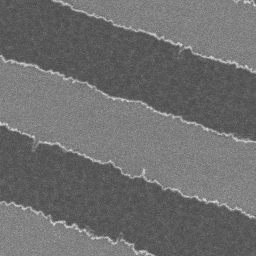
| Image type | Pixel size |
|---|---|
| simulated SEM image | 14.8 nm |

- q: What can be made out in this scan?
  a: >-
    one or a few lines or trenches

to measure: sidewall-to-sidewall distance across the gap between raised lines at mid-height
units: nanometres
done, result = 981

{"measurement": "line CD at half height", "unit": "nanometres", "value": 1020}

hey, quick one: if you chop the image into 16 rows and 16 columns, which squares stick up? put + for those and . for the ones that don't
+++++...........
+++++++.........
++++++++++......
+++++++++++++...
...+++++++++++++
......++++++++++
.........+++++++
...........+++++
++............++
+++++...........
+++++++.........
++++++++++......
+++++++++++++...
...+++++++++++++
.....+++++++++++
........++++++++